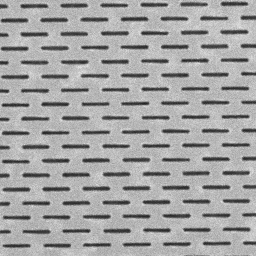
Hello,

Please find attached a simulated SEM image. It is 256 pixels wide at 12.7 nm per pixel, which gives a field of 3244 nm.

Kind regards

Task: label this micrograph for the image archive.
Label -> a regular array of holes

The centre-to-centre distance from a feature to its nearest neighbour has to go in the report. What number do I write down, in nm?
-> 300